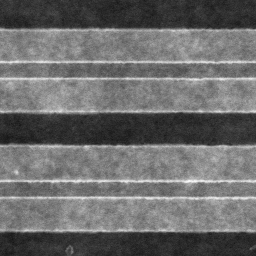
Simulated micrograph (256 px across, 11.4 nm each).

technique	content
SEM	lines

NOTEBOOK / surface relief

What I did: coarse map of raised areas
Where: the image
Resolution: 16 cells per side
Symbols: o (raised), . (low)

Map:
................
................
oooooooooooooooo
oooooooooooooooo
oooooooooooooooo
oooooooooooooooo
oooooooooooooooo
................
................
oooooooooooooooo
oooooooooooooooo
oooooooooooooooo
oooooooooooooooo
oooooooooooooooo
................
................